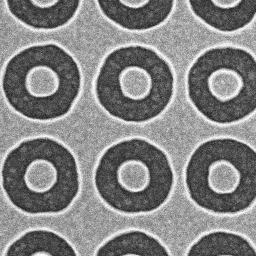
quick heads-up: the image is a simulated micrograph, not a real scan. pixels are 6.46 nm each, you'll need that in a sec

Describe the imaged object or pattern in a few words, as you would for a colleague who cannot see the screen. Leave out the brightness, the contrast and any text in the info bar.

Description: ring-shaped grooves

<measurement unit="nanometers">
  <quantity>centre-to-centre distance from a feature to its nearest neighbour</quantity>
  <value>598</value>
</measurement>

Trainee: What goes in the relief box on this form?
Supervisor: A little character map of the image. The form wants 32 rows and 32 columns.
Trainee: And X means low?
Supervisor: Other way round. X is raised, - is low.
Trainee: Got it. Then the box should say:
X---XXX---XX---XXX----XX---XXX--
X--------XXXX--------XXX--------
XX-------XXXXX-------XXXX------X
XXXX---XXXXXXXXX---XXXXXXXX---XX
XXXXXXXXXXXXXXXXXXXXXXXXXXXXXXXX
XXXXXX-XXXXXXXXXXXXXXXXXXXXXXXXX
XXX-----XXXXXX-----XXXXXXX-----X
X--------XXXX--------XXXX-------
X---XX----XXX---X----XXX--------
---XXXX---XX---XXXX---XX--XXXX--
---XXXX---XX---XXXX---X---XXXX--
X---XXX---XX---XXXX---XX--XXXX--
X--------XXX---------XXX--------
XX-------XXXX--------XXXX-------
XXX-----XXXXXX------XXXXXX-----X
XXXXXXXXXXXXXXXXXXXXXXXXXXXXXXXX
XXXXXXXXXXXXXXXXXXXXXXXXXXXXXXXX
XXXX---XXXXXXXXX--XXXXXXXX---XXX
XX------XXXXXX------XXXXX------X
X--------XXXX--------XXX--------
----XX---XXX---XXX---XXX---XX---
---XXXX---XX---XXXX---X---XXXX--
---XXXX---XX---XXX----X---XXXX--
X---XX----XX----XX---XX---XXX---
X--------XXXX--------XXX--------
XX-------XXXX-------XXXXX------X
XXX----XXXXXXXX---XXXXXXXXX---XX
XXXXXXXXXXXXXXXXXXXXXXXXXXXXXXXX
XXXXXXXXXXXXXXXXXXXXXXXXXXXXXXXX
XXX----XXXXXXX-----XXXXXX-----XX
X--------XXXX-------XXXX-------X
X--------XXX---------XXX--------